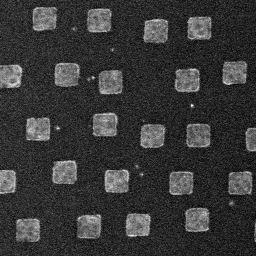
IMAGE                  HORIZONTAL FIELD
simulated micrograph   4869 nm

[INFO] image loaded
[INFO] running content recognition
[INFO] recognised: a regular array of raised bodies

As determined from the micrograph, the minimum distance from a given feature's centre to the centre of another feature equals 907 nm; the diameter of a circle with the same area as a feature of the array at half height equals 24.8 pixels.